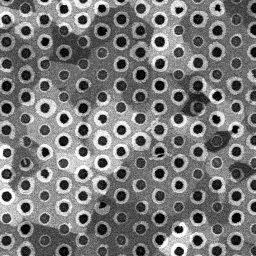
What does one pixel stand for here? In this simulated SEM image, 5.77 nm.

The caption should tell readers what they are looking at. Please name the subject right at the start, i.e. a regular array of holes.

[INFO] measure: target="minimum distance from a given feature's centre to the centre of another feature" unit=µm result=0.125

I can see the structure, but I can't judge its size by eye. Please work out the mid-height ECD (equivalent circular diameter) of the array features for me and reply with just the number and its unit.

59.3 nm